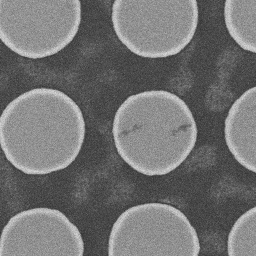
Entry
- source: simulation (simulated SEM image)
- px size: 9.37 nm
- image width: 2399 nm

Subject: raised bodies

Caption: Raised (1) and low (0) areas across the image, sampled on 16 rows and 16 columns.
1111100111110011
1111100111110011
1111000011110001
0000000000000000
0000000000000000
0000000000000000
0111100011100001
1111100111110011
1111100111110011
1111100011110001
0111000011100000
0000000000000000
0000000000000000
0111000011100001
1111100111110001
1111100111110011